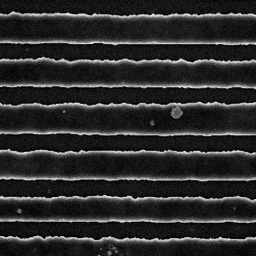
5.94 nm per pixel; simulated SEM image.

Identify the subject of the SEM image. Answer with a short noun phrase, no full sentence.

lines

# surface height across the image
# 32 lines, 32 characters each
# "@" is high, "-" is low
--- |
--------------------------------
--------------------------------
@@@@@@@@@@@@@@@@@@@@@@@@@@@@@@@@
@@@@@@@@@@@@@@@@@@@@@@@@@@@@@@@@
@@@@@@@@@@@@@@@@@@@@@@@@@@@@@@@@
----------------------------@@@-
--------------------------------
@@@@@@@--------@----------------
@@@@@@@@@@@@@@@@@@@@@@@@@@@@@@@@
@@@@@@@@@@@@@@@@@@@@@@@@@@@@@@@@
@@@@@@@@@@@@@@@@@@@@@@@@@@@@@@@@
--------------------------------
--------------------------------
@@@@@@@@@@@@@@@@@@@@@@@@@@@@@@@@
@@@@@@@@@@@@@@@@@@@@@@@@@@@@@@@@
@@@@@@@@@@@@@@@@@@@@@@@@@@@@@@@@
@@@@@@@@@@@@@@@@@@@@@@@@@@@@@@@@
--------------------------------
--------------------------------
@@@@@@@@@@@@@@@@@@@@@@@@@@@@@@@@
@@@@@@@@@@@@@@@@@@@@@@@@@@@@@@@@
@@@@@@@@@@@@@@@@@@@@@@@@@@@@@@@@
-------------------------@------
--------------------------------
------------@-------------------
@@@@@@@@@@@@@@@@@@@@@@@@@@@@@@@@
@@@@@@@@@@@@@@@@@@@@@@@@@@@@@@@@
@@@@@@@@@@@@@@@@@@@@@@@@@@@@@@@@
--------------------------------
--------------------------------
@@@@@@@@@@@@@@@@@@@@@@@@@@@@@@@@
@@@@@@@@@@@@@@@@@@@@@@@@@@@@@@@@